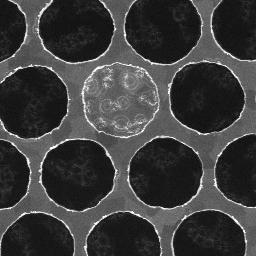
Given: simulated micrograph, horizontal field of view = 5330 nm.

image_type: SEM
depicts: holes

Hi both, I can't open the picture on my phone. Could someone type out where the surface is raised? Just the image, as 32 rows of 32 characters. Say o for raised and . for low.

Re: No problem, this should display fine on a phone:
..oooo.......oooo.......ooo.....
...oo.........oo.........oo.....
...oo.........oo.........o......
...oo.........oo.........o......
...oo.........oo.........oo.....
...oo.........oo.........oo.....
..oooo.......oooo.......oooo....
.ooooooo....oooooo....oooooooo..
ooo...ooooooooooooooooo.....oooo
o......ooooooooooooooo.......ooo
........ooooooooooooo.........oo
........ooooooooooooo.........oo
.........oooooooooooo..........o
........ooooooooooooo.........oo
........oooooooooooooo........oo
........ooooooooooooooo......ooo
o.....ooooooooooooooooooo..ooooo
ooooooooo..oooooooo...ooooooo...
..ooooo......ooooo......oooo....
...ooo........ooo........oo.....
...oo.........oo.........oo.....
....o.........oo.........oo.....
....o.........oo.........oo.....
...ooo........oo.........oo.....
...ooo.......oooo.......oooo....
..ooooo.....oooooo.....ooooooo..
ooooooooooooooo.ooooooooo...oooo
oo.....oooooo.....ooooo......ooo
o.......oooo.......ooo........oo
.........oo.........oo.........o
.........oo.........o..........o
.........oo.........oo.........o